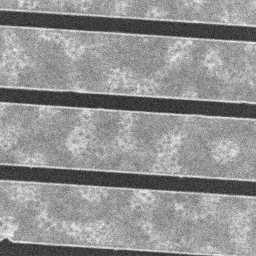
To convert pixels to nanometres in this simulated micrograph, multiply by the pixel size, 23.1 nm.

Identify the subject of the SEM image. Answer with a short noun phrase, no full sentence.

one or a few lines or trenches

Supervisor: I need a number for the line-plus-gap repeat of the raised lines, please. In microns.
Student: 1.78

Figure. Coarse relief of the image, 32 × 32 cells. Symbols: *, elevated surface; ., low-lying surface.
********************************
.....***************************
....................************
***.............................
******************..............
********************************
********************************
********************************
********************************
********************************
********************************
...........*********************
..........................******
*********.......................
*************************.......
********************************
********************************
********************************
********************************
********************************
.*******************************
................****************
................................
**************..................
****************************....
********************************
********************************
********************************
*.******************************
********************************
.......*************************
......................**********